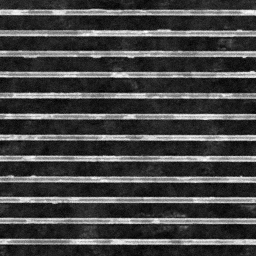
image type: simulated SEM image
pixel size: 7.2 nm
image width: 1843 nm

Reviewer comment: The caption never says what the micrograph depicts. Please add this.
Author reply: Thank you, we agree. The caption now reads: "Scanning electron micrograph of parallel lines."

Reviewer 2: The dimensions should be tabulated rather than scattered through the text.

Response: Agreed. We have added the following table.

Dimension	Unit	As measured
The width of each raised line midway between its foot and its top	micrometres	0.0279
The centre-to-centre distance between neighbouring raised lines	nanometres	150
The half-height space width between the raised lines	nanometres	117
